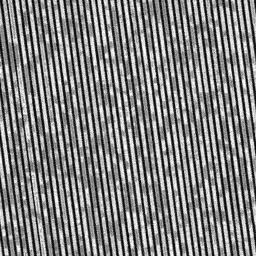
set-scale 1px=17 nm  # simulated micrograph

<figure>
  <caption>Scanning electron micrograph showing parallel lines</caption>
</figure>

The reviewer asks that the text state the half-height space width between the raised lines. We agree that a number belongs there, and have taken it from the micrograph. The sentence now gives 63.4 nm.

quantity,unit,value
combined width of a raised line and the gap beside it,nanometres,107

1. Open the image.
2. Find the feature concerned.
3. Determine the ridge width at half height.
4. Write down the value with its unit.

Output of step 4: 48.6 nanometres